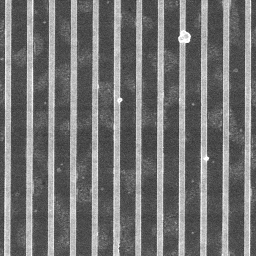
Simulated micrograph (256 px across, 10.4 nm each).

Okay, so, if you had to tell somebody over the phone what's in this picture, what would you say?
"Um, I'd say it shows parallel lines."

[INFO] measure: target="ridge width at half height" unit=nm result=58.7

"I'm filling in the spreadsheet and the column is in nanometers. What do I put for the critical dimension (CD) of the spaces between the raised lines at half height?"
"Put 170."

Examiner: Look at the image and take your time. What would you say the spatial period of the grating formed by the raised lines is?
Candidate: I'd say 228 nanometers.